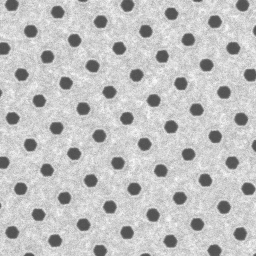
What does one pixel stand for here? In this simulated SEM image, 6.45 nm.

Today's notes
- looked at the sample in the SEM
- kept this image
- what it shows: a regular array of holes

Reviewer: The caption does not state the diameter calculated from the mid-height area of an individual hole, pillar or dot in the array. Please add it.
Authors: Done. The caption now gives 81.4 nanometers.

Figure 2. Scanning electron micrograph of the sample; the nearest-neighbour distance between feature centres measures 200 nanometres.